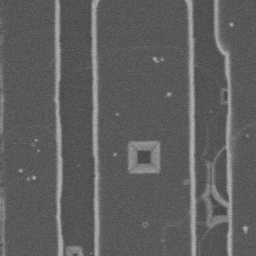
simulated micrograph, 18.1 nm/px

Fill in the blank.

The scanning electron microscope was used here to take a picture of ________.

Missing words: wiring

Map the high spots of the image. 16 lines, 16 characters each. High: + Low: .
++++..++++++..++
++++..++++++..++
++++..++++++..++
++++..++++++..++
++++..++++++..++
++++..++++++..++
++++..++++++..++
++++..++++++..++
++++..++++++..++
++++..++..++..++
++++..++++++..++
++++..++++++..++
++++..++++++..++
++++..++++++..++
++++..++++++..++
++++..++++++..++